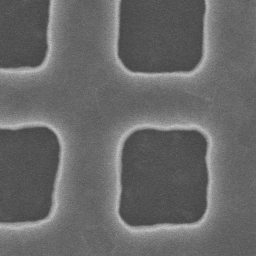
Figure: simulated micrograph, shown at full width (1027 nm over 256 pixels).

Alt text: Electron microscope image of holes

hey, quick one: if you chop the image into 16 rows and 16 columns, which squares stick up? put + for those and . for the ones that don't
...++++......+++
...++++......+++
...++++......+++
...++++......+++
++++++++....++++
++++++++++++++++
++++++++++++++++
++++++++++++++++
....++++.....+++
....++++.....+++
....+++......+++
....++++.....+++
...++++......+++
...+++++.....+++
++++++++++++++++
++++++++++++++++